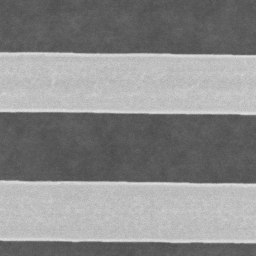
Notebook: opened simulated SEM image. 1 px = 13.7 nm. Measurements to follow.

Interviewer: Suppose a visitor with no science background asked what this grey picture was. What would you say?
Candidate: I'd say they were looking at wiring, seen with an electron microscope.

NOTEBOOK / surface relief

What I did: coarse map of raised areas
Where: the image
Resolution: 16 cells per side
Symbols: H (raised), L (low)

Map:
LLLLLLLLLLLLLLLL
LLLLLLLLLLLLLLLL
LLLLLLLLLLLLLLLL
HHHHHHHHHHHHHHHL
HHHHHHHHHHHHHHHH
HHHHHHHHHHHHHHHH
HHHHHHHHHHHHHHHH
LLLLLLLLLLLLLLLL
LLLLLLLLLLLLLLLL
LLLLLLLLLLLLLLLL
LLLLLLLLLLLLLLLL
HHHHHHHHHHHHLLLL
HHHHHHHHHHHHHHHH
HHHHHHHHHHHHHHHH
HHHHHHHHHHHHHHHH
LLLLLLLLLLLLLLLL